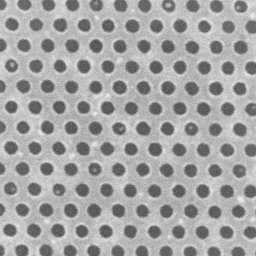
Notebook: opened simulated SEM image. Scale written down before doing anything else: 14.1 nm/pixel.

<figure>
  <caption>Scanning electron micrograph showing a regular array of holes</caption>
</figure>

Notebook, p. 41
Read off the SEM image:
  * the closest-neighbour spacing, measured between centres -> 331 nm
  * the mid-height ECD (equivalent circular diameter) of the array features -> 0.204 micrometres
